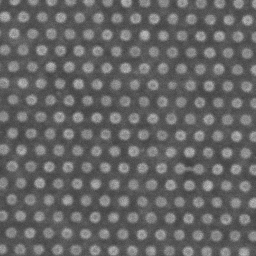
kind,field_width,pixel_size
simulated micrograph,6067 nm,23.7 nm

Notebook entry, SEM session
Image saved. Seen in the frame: a regular array of raised bodies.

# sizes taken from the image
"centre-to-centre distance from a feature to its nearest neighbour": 438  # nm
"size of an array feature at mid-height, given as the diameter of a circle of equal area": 0.214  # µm